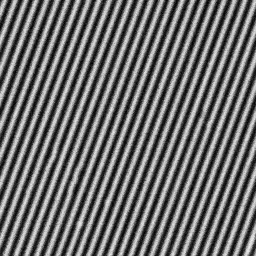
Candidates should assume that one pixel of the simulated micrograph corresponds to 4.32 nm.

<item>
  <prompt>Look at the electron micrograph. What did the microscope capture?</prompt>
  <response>parallel lines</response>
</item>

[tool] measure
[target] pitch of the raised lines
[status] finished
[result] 42.4 nm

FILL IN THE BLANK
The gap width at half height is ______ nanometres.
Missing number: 25.9